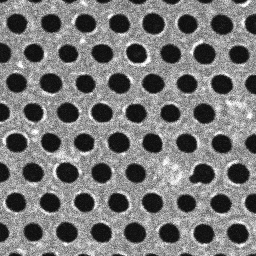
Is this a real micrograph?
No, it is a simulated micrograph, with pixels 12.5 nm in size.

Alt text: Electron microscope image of a regular array of holes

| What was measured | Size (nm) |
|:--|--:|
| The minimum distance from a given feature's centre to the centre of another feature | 425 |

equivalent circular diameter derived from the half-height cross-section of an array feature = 0.263 micrometres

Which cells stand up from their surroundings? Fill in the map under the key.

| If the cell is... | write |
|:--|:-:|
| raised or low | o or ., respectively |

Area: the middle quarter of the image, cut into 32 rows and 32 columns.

oooooooooooooooooooooooooooooooo
oooooooooooooooooooooooooooooooo
ooooo.oooooo...ooooooo.ooooooooo
ooo....oooo.....oooo.....oooo...
ooo.....ooo......ooo.....ooo....
ooo.....ooo......ooo.....ooo....
oooo...ooooo....oooo.....oooo...
ooooooooooooo..ooooooo.ooooooooo
oooooooooooooooooooooooooooooooo
.ooooooooooooooooooooooooooooooo
...oooo....ooooo....ooooo...oooo
....ooo.....ooo......ooo.....ooo
....ooo.....ooo......ooo.....ooo
....ooo.....oooo....oooo.....ooo
...ooooo...oooooo...oooooo..oooo
oooooooooooooooooooooooooooooooo
oooooooooooooooooooooooooooooooo
oooo..oooooo...oooooo..oooooo..o
ooo....oooo.....oooo....oooo....
oo......ooo......ooo.....ooo....
ooo.....ooo......ooo.....ooo....
oooo...ooooo....oooo.....oooo...
oooooooooooooooooooooooooooooooo
oooooooooooooooooooooooooooooooo
oooooooooooooooooooooooooooooooo
...oooo....ooooo...ooooooooooooo
....ooo.....ooo.....oooooooooooo
....ooo.....ooo......ooooooooooo
...oooo.....oooo....ooooooooooo.
...ooooo...oooooo..ooooooooooooo
oooooooooooooooooooooooooooooooo
oooooooooooooooooooooooooooooooo